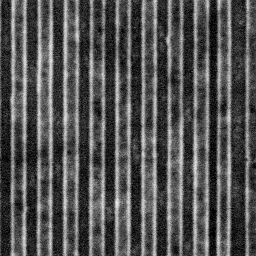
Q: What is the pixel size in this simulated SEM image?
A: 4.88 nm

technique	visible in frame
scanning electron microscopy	parallel lines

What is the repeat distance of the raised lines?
125 nm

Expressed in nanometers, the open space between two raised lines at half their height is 61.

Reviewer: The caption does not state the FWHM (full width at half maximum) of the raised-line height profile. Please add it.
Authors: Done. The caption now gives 0.0659 micrometres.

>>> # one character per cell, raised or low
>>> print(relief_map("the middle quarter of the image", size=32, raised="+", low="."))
+++....+++...+++....+++...+++...
+++....+++...+++....+++...+++...
+++....+++...+++....+++...+++...
+++....+++...+++....+++...+++...
+++....+++...+++....+++...+++...
+++....+++...+++....+++...+++...
+++....+++...+++....+++...+++...
+++....+++...+++....+++...+++...
+++....+++...+++....+++...+++...
+++....+++...+++....+++...+++...
+++....+++...+++....+++...+++...
+++....+++...+++....+++...+++...
+++....+++...+++....+++...+++...
+++....+++...+++....+++...+++...
+++....+++...+++....+++...+++...
+++....+++...+++....+++...+++...
+++....+++...+++....+++...+++...
+++....+++...+++....+++...+++...
+++....+++...+++....+++...+++...
+++....+++...+++....+++...+++...
+++....+++...+++....+++...+++...
+++....+++...+++....+++...+++...
+++....+++...+++....+++...+++...
+++....+++...+++....+++...+++...
+++....+++...+++....+++...+++...
+++....+++...+++....+++...+++...
+++....+++...+++....+++...+++...
+++....+++...+++....+++...+++...
+++....+++...+++....+++...+++...
+++....+++...+++....+++...+++...
+++....+++...+++....+++...+++...
+++....+++...+++....+++...+++...